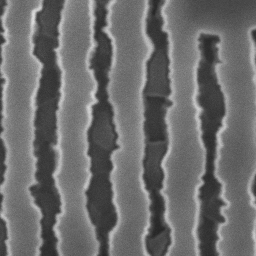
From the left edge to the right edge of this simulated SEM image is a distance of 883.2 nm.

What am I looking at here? parallel lines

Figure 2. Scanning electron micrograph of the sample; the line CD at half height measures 119 nanometres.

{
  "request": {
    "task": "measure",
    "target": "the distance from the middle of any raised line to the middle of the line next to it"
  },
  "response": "187 nm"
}